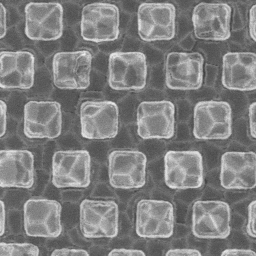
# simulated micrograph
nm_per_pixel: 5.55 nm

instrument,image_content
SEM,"a regular array of raised bodies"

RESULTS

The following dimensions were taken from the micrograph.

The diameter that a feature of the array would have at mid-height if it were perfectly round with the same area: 0.218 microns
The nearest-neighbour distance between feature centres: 0.309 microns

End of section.